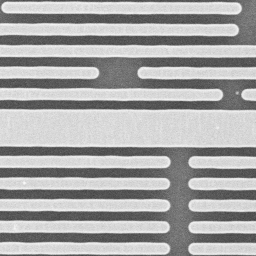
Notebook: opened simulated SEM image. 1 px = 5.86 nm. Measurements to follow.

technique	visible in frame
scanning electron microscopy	groups of lines, slits or small figures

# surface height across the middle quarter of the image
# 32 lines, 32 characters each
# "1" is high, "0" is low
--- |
00000000000000000000000000000000
11111111100000000001111111111111
11111111100000000001111111111111
11111111000000000001111111111111
00000000000000000000000000000000
00000000000000000000000000000000
11111111111111111111111111111111
11111111111111111111111111111111
11111111111111111111111111111111
00000000000000000000000000000000
00000000000000000000000000000000
11111111111111111100000001111111
11111111111111111111111111111111
11111111111111111111111111111111
11111111111111111111111111111111
11111111111111111111111111111111
11111111111111111111111111111111
11111111111111111111111111111111
11111111111111111111111111111111
11111111111111111111111111111111
00111100011111110111111111111111
00000000000000000000000000000000
00000000000000000000000000000000
11111111111111111111111111000000
11111111111111111111111111000001
11111111111111111111111111000000
00000000000000000000000000000000
00000000000000000000000000000000
00000000000000000000000000000000
11111111111111111111111111000001
11111111111111111111111111000001
00000000000000000000000000000000